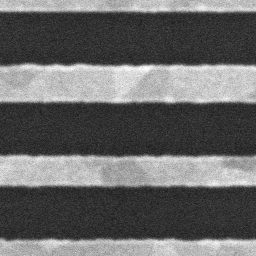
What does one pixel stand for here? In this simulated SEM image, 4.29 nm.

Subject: lines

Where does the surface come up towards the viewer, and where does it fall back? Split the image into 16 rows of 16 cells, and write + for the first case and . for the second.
++++++++++++++++
................
................
................
++++++++++++++++
++++++++++++++++
................
................
................
................
++++++++++++++++
++++++++++++++++
................
................
................
++++++++++++++++